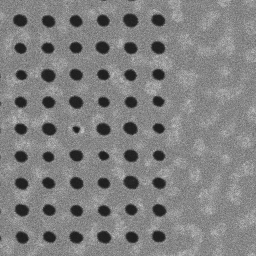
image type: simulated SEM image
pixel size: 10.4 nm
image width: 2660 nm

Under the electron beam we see a regular array of holes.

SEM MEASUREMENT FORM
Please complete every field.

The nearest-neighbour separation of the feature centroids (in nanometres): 279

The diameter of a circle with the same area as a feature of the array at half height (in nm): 132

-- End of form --